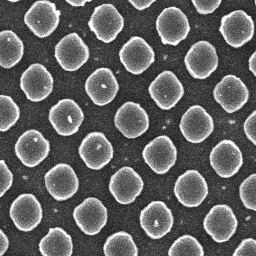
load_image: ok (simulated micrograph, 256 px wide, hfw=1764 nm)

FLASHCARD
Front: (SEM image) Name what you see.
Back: a regular array of raised bodies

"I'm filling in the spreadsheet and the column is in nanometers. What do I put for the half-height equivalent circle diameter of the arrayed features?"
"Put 233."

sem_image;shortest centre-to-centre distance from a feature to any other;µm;0.31